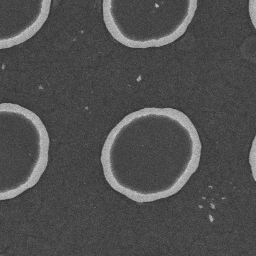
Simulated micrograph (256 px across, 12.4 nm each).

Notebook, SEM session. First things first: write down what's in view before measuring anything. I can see raised bodies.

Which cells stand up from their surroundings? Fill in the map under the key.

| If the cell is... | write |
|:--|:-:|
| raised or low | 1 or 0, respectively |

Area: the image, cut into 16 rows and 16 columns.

1110000111110000
1100000111110000
1000000011000000
0000000000000000
0000000000000000
0000000000000000
0000000000000000
1100000011100000
1110000111110000
1110000111110000
1110000111110000
1100000111100000
0000000000000000
0000000000000000
0000000000000000
0000000000000000